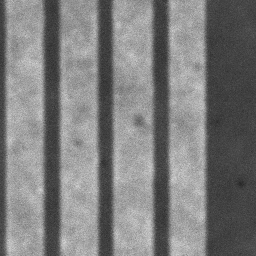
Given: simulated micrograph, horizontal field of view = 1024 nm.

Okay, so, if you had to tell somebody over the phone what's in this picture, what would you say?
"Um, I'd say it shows wiring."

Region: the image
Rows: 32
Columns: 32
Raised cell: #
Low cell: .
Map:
.####...####..#####..####.......
.####...####..#####..####.......
.####...####..#####..####.......
.####...####..#####..####.......
.####...####..#####..####.......
.####...####..#####..####.......
.####...####..#####..####.......
.####...####..#####..####.......
.####...####..#####..####.......
.####...####..#####..####.......
.####...####..#####..####.......
.####...####..#####..####.......
.####...####..#####..####.......
.####...####..#####..#####......
.####...####..#####..#####......
.####...####..#####..####.......
.####...####..#####..####.......
.####...####..#####..####.......
.####...####..#####..####.......
.####...####..#####..####.......
.####...####..#####..#####......
.####...####..#####..####.......
.####...####..#####..#####......
.####...####..#####..#####......
.####...####..#####..#####......
.####...####..#####..#####......
.####...####..#####..#####......
.####...####..#####..#####......
.####...####..#####..#####......
.####...####..#####..#####......
.####...####..#####..#####......
.####...####..#####..#####......